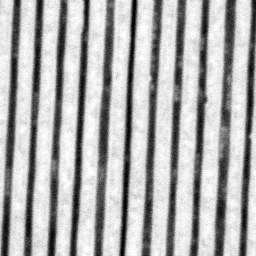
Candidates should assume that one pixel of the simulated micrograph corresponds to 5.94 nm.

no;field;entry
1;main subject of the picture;parallel lines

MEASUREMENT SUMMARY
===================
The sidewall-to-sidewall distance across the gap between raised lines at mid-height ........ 57.8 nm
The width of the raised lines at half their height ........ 0.0852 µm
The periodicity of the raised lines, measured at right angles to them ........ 142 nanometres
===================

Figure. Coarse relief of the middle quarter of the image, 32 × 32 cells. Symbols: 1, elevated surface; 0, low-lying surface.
11110011100011110011100011100011
11110011100011110011100011100011
11110011100011110011100011100011
11110011100011110011110011100011
11100011100011110011100011100011
11100011100011110011100011100011
11100011100011100111100011100011
11100011100011100111100011100011
11100011100011100111100011100011
11100111100011100111100011100011
11100111100011100111100011100011
11100111100011100111100111100011
11100111100011100111100111100111
11100111100011100111100111100111
11100111100011100111100111000111
11100111100011100111100111100111
11100111000011100111100111100111
11100111000011100111100111100111
11100111000111100111000111100111
11100111000111100111000111000111
11100111000111100111000111000111
11100111000111100111000111000111
11100111000111100111000111000111
11100111000111100111000111000111
11000111000111100111000111000111
11000111000111100111000111000111
11000111000111000111000111000111
11000111000111000111000111000111
11000111000111000111000111000111
11000111000111100111000111000111
11000111000111100111000111000111
11001111000111001111000111001111